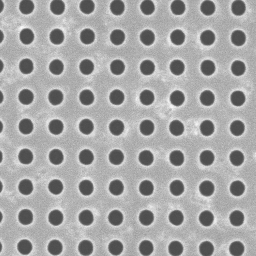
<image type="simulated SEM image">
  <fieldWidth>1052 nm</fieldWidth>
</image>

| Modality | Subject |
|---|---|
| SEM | a regular array of holes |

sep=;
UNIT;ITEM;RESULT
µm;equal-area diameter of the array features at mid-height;0.059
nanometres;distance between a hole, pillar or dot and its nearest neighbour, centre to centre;123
